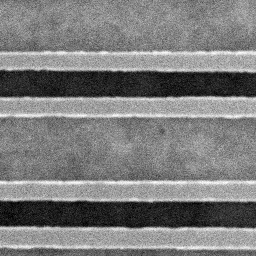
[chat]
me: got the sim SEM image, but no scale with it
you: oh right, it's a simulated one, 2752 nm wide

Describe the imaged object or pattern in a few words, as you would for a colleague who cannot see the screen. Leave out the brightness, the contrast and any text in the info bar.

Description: lines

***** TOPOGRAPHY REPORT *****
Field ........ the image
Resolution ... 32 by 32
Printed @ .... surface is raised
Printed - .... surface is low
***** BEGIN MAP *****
--------------------------------
--------------------------------
--------------------------------
--------------------------------
--------------------------------
--------------------------------
--------------------------------
@@@@@@@@@@@@@@@@@@@@@@@@@@@@@@@@
@@@@@@@@@@@@@@@@@@@@@@@@@@@@@@@@
--------------------------------
--------------------------------
--------------------------------
@@@@@@@@@@@@@@@@@@@@@@@@@@@@@@@@
@@@@@@@@@@@@@@@@@@@@@@@@@@@@@@@@
@-@@@@--@@@@@@@@@@@@@@@@@@@@@@@@
--------------------------------
--------------------------------
--------------------------------
--------------------------------
--------------------------------
--------------------------------
--------------------------------
--------------------------------
@@@@@@@@@@@@@@@@@@@@@@@@@@@@@@@@
@@@@@@@@@@@@@@@@@@@@@@@@@@@@@@@@
--------------------------------
--------------------------------
--------------------------------
@@@@@@@@------------------------
@@@@@@@@@@@@@@@@@@@@@@@@@@@@@@@@
@@@@@@@@@@@@@@@@@@@@@@@@@@@@@@@@
--------------------------------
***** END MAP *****